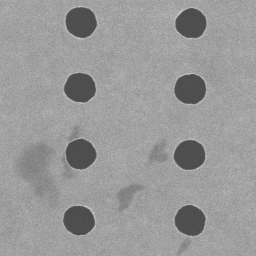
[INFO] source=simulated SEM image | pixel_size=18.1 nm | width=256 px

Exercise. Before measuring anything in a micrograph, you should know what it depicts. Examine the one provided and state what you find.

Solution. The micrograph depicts a regular array of holes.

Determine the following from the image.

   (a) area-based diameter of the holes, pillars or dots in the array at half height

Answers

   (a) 554 nanometers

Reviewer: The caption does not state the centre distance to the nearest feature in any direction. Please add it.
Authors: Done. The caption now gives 1190 nm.